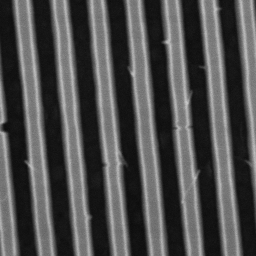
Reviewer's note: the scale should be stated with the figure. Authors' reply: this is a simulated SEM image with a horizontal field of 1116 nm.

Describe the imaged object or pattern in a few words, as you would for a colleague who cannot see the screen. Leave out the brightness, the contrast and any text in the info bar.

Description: parallel lines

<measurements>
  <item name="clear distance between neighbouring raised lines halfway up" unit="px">19.5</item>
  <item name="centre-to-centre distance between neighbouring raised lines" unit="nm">161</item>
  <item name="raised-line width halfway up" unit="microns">0.0727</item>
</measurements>